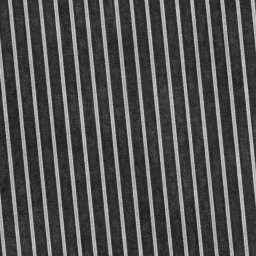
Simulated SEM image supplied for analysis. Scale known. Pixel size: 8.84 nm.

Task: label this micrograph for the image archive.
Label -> parallel lines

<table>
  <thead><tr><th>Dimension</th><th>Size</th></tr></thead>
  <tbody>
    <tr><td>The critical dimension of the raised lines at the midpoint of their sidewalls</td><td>2.86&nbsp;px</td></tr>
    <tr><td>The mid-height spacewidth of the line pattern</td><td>0.108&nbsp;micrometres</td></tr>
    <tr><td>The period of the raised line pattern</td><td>0.134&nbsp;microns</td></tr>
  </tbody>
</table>